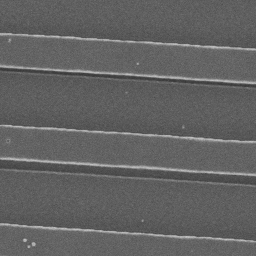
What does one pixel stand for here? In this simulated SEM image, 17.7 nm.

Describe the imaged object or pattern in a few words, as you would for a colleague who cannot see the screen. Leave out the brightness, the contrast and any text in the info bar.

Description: lines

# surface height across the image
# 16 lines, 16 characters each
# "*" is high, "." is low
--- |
................
................
*******.........
****************
.....***********
................
................
................
***********.....
****************
.........*******
................
................
................
*******.........
****************